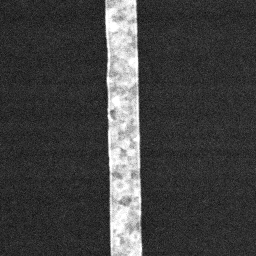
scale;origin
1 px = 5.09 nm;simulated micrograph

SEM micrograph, one or a few lines or trenches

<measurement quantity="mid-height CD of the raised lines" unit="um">0.149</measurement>